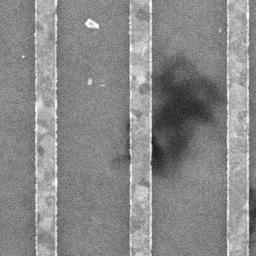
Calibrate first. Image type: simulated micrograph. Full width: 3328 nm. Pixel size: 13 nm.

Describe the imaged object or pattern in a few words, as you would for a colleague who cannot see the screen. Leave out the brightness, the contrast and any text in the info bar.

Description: lines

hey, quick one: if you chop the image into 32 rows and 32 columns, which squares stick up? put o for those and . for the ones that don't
.....oo.........ooo.........ooo.
.....oo.........ooo.........ooo.
.....oo.........ooo.........ooo.
.....oo.........ooo.........ooo.
.....oo.........ooo.........ooo.
....ooo.........ooo.........ooo.
.....oo.........ooo.........ooo.
.....oo.........ooo.........ooo.
.....oo.........ooo.........ooo.
.....oo.........ooo.........ooo.
.....oo.........ooo.........ooo.
.....oo.........ooo.........ooo.
.....oo.........ooo.........ooo.
.....oo.........ooo.........ooo.
.....oo.........ooo.........ooo.
.....oo.........ooo.........ooo.
.....oo.........ooo.........ooo.
.....oo.........ooo.........ooo.
.....oo.........ooo.........ooo.
.....oo.........ooo.........ooo.
.....oo.........ooo.........ooo.
.....oo.........ooo.........ooo.
.....oo.........ooo.........ooo.
.....oo.........ooo.........ooo.
.....oo.........ooo.........ooo.
.....oo.........ooo.........ooo.
.....oo.........ooo.........ooo.
.....oo.........ooo.........ooo.
.....oo.........ooo.........ooo.
.....oo.........ooo.........ooo.
.....oo.........ooo.........ooo.
.....oo.........ooo.........ooo.